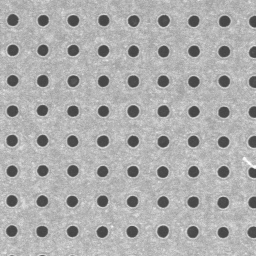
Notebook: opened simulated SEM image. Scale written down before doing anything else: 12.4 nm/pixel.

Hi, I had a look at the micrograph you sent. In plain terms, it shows a regular array of holes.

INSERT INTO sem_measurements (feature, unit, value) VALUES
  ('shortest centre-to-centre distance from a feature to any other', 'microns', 0.368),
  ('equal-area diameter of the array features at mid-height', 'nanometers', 148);